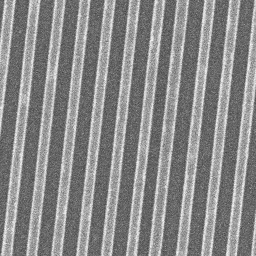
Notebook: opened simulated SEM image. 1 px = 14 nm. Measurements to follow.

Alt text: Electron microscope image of parallel lines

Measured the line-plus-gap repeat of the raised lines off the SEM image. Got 348 nm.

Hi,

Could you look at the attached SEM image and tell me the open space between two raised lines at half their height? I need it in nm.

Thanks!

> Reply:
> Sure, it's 216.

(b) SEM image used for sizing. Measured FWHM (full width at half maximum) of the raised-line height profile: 132 nanometers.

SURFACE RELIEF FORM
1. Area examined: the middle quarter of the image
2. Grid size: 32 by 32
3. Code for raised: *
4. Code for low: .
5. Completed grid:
..**.....**....**....**....**...
..**....***....**....**....**...
..**....**.....**....**...***...
..**....**....***....**...***...
..**....**....***....**...***...
..**....**....**....***...**....
..**....**....**....***...**....
..**....**....**....**....**....
.***....**....**....**....**....
.**.....**....**....**....**....
.**....***....**....**...***....
.**....**.....**....**...***....
.**....**....***....**...***....
.**....**....***....**...***....
.**....**....**....***...***....
.**....**....**....***...***....
***....**....**....**....**.....
***....**....**....**....**.....
**.....**....**....**....**....*
**....***....**....**...***....*
**....**.....**....**...***....*
**....**....***....**...***....*
**....**....***....**...***....*
**....**....**....***...**.....*
**....**....**....***...**.....*
**....**....**....**....**.....*
**....**....**....**....**.....*
*.....**....**....**....**....**
*.....**....**....**...***....**
*.....*.....**....**...***....**
*....**....***....**...***....**
*....**....***....**...***....**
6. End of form